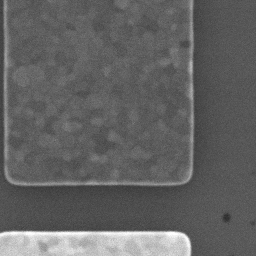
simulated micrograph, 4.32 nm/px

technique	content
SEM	wiring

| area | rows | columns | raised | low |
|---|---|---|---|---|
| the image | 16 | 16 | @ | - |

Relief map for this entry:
@@@@@@@@@@@@----
@@@@@@@@@@@@----
@@@@@@@@@@@@----
@@@@@@@@@@@@----
@@@@@@@@@@@@----
@@@@@@@@@@@@----
@@@@@@@@@@@@----
@@@@@@@@@@@@----
@@@@@@@@@@@@----
@@@@@@@@@@@@----
@@@@@@@@@@@@----
-@@@@@@@@@@-----
----------------
----------------
----------------
@@@@@@@@@@@@----